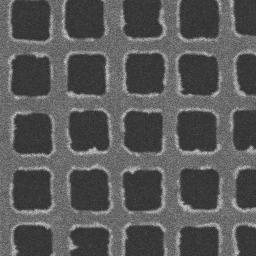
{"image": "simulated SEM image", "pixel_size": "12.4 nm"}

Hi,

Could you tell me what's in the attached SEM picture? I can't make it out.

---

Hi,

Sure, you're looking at a regular array of holes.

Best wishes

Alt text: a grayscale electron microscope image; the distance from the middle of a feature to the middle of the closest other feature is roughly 671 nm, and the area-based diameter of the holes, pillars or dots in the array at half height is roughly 0.546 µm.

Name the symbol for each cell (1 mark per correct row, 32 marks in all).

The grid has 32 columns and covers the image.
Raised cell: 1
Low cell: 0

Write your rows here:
11000011000001100000110000011000
10000011000001100000110000011000
10000011000001110000110000011000
10000011000001100000110000011000
11000011100001110000111000011110
11111111111111111111111111111111
11111111111111111111111111111111
11000011000001110000010000011100
10000011000001110000010000011100
10000011000001110000010000011100
10000011000001110000111000011100
10000011100001110000111000011100
11111111111111111111111111111111
11111111111111111111111111111111
11000011100001110000110000011000
11000011100000110000110000011000
11000011100000110000110000011000
11000001100000110000110000011000
11000001100000110000111000011001
11111111111111111111111111111111
11111111111111111111111111111111
11000011100001111000111000011100
11000011100000100000110000011100
11000011100000100000111000011000
10000011100000110000111000011000
11000011100000110000111000011100
11111111111111111111111111111111
11111111111111111111111111111111
11000011100001110000111000011100
11000001100000110000010000011000
11000001100000110000010000011100
11000001100000110000010000011100